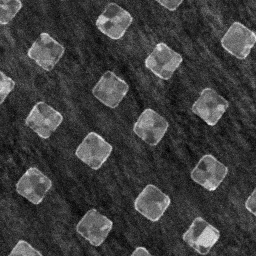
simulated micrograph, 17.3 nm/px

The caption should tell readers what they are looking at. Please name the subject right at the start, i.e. a regular array of raised bodies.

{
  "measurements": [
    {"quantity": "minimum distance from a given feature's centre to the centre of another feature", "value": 1050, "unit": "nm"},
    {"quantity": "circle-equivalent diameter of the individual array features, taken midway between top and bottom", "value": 554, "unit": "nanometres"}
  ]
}